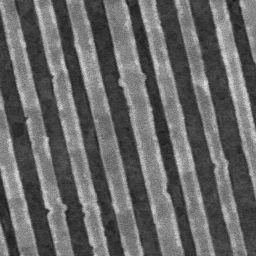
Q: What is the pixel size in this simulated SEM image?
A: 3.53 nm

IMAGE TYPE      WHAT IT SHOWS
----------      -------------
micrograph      parallel lines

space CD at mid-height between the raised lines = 0.0662 micrometres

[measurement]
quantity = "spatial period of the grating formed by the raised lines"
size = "121 nanometers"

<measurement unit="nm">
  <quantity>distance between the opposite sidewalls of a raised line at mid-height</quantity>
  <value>55.9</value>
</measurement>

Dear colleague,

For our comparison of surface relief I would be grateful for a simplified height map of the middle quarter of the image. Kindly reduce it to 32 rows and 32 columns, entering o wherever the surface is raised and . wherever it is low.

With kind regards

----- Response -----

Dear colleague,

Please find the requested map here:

....ooooo.....ooooo....ooo......
o...ooooo.....ooooo....oooo.....
o....oooo.....oooooo...oooo.....
o....oooo.....oooooo...oooo.....
o....ooooo....oooooo...oooo.....
oo...ooooo....oooooo....oooo....
oo....oooo.....ooooo....oooo....
oo....oooo.....oooooo...oooo....
oo....oooo......ooooo...oooo....
oo....ooooo.....ooooo...ooooo...
ooo....oooo.....oooooo...oooo...
ooo....oooo.....oooooo...oooo...
ooo....oooo.....oooooo...ooooo..
ooo....ooooo.....ooooo....oooo..
oooo....oooo.....ooooo....oooo..
oooo....oooo.....ooooo....oooo..
oooo....oooo.....oooooo...oooo..
oooo....ooooo.....ooooo...ooooo.
oooo.....oooo.....ooooo....oooo.
.oooo....oooo.....ooooo....oooo.
.oooo....oooo.....oooooo...oooo.
.oooo....ooooo....oooooo....oooo
.oooo....ooooo.....ooooo....oooo
..ooo....ooooo.....ooooo....oooo
..oooo....oooo.....ooooo....oooo
..oooo....ooooo....oooooo...oooo
..oooo....ooooo.....ooooo....ooo
...ooo.....oooo.....ooooo....ooo
...ooo.....oooo.....oooooo...ooo
...oooo....ooooo....oooooo...ooo
...oooo....ooooo....oooooo....oo
...oooo.....oooo.....ooooo....oo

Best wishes